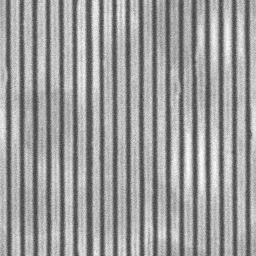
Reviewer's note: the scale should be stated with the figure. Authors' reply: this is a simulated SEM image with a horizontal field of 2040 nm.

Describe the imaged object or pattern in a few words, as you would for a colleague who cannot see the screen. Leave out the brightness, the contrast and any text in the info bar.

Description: parallel lines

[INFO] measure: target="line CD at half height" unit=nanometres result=49.8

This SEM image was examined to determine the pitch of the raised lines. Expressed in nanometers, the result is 106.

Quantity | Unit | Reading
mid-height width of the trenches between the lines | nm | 56.8